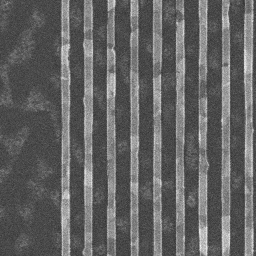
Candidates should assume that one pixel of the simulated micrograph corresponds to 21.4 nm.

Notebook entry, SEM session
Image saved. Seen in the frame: parallel lines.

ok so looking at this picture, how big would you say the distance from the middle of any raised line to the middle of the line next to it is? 490 nm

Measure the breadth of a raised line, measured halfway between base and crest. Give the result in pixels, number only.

6.62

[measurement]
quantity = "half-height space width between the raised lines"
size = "342 nanometers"